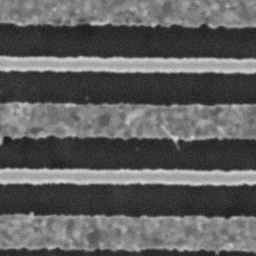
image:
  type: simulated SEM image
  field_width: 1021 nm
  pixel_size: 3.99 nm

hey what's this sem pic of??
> lines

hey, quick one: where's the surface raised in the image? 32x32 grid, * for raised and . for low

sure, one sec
********************************
********************************
********************************
................................
................................
................................
................................
................................
................................
................................
................................
................................
................................
********************************
********************************
********************************
********************************
.......................*........
................................
................................
................................
................................
................................
................................
................................
................................
................................
********************************
********************************
********************************
********************************
................................